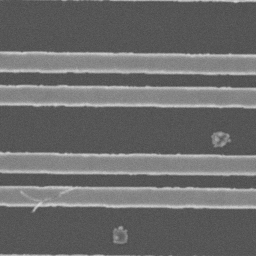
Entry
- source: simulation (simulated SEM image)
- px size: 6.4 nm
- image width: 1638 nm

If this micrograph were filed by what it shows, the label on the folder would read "lines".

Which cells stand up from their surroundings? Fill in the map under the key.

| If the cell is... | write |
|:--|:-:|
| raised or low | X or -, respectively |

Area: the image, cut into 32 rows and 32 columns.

--------------------------------
--------------------------------
--------------------------------
--------------------------------
--------------------------------
--------------------------------
--------------------------------
XXXXXXXXXXXXXXXXXXXXXXXXXXXXXXXX
XXXXXXXXXXXXXXXXXXXXXXXXXXXXXXXX
--------------------------------
--------------------------------
XXXXXXXXXXXXXXXXXXXXXXXXXXXXXXXX
XXXXXXXXXXXXXXXXXXXXXXXXXXXXXXXX
--------------------------------
--------------------------------
--------------------------------
--------------------------------
---------------------------X----
--------------------------------
XXXXXXXXXXXXXXXXXXXXXXXXXXXX----
XXXXXXXXXXXXXXXXXXXXXXXXXXXXXXXX
-XXXXXXXXXXXXXXXXXXXXXXXXXXXXXXX
--------------------------------
XXXXXXXXXXXXXXXXXXXXXXXX--------
XXXXXXXXXXXXXXXXXXXXXXXXXXXXXXXX
XXXXXXXXXXXXXXXXXXXXXXXXXXXXXXXX
--------------------------------
--------------------------------
--------------------------------
--------------------------------
--------------------------------
--------------------------------